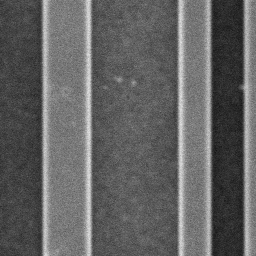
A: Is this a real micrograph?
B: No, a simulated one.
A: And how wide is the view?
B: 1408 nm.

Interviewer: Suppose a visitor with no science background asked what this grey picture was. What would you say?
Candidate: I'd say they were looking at groups of lines, slits or small figures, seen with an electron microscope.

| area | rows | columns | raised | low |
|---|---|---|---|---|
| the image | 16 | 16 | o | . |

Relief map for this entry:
...ooo.....oo..o
...ooo.....oo..o
...ooo.....oo..o
...ooo.....oo..o
...ooo.....oo..o
...ooo.....oo..o
...ooo.....oo..o
...ooo.....oo..o
...ooo.....oo..o
...ooo.....oo..o
...ooo.....oo..o
...ooo.....oo..o
...ooo.....oo..o
...ooo.....oo..o
...ooo.....oo..o
...ooo.....oo..o